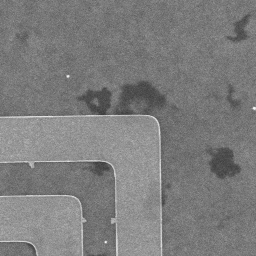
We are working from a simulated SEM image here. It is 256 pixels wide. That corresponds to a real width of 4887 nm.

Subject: groups of lines, slits or small figures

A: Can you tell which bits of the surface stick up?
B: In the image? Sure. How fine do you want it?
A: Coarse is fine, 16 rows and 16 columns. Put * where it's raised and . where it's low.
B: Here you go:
................
................
................
................
................
................
................
**********......
**********......
**********......
.......***......
.......***......
*****..***......
*****..***......
*****..***......
..***..***......